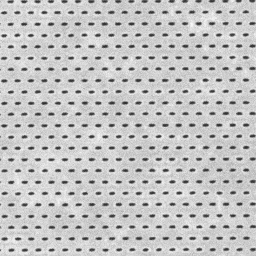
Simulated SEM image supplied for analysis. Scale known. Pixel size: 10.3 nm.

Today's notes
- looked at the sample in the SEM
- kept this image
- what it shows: a regular array of holes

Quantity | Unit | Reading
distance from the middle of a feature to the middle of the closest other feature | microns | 0.132